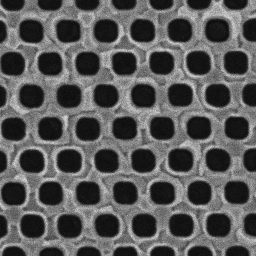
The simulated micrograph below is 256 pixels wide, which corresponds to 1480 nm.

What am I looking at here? a regular array of holes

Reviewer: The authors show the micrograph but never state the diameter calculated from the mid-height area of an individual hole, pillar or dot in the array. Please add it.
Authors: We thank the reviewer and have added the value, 0.142 micrometres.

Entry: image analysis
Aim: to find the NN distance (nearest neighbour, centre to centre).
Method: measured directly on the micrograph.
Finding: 0.214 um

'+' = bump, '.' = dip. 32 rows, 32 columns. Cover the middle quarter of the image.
+++......+++......+++.......+++.
+++......+++......++++.....++++.
++++....+++++....++++++...++++++
++++++++++++++++++++++++++++++++
++++++++++++++++++++++++++++++++
...+++++....++++++....+++++....+
....++++.....++++......+++......
....+++.......+++......+++......
....+++.......+++......+++......
....++++.....++++......+++......
...++++++...++++++....+++++....+
++++++++++++++++++++++++++++++++
++++++++++++++++++++++++++++++++
+++++..+++++++...+++++....++++++
+++......+++......++++.....++++.
+++......+++......+++.......+++.
+++......+++......+++.......+++.
+++......+++......++++.....++++.
++++....+++++.....+++++....+++++
++++++++++++++++++++++++++++++++
++++++++++++++++++++++++++++++++
..+++++++...+++++++..++++++....+
....++++.....++++.....++++......
....++++......+++......+++......
....++++......+++......+++......
....++++......+++......+++......
....+++++....+++++....+++++....+
++++++++++++++++++++++++++++++++
++++++++++++++++++++++++++++++++
+++++..+++++++..++++++++..++++++
+++......++++.....++++.....++++.
+++......+++......+++.......+++.